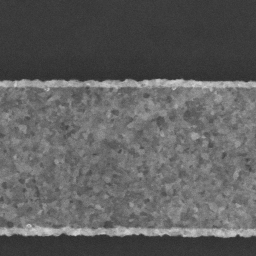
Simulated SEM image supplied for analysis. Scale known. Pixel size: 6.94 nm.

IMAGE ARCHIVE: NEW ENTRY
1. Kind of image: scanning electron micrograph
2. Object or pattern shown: one or a few lines or trenches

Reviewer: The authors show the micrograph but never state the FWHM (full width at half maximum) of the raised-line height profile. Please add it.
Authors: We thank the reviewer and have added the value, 1030 nm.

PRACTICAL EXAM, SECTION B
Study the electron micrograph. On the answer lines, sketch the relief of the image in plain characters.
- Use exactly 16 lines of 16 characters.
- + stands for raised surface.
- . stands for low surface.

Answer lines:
................
................
................
................
................
++++++++++++++++
++++++++++++++++
++++++++++++++++
++++++++++++++++
++++++++++++++++
++++++++++++++++
++++++++++++++++
++++++++++++++++
++++++++++++++++
...........+++++
................